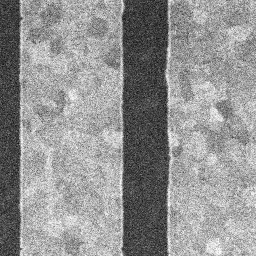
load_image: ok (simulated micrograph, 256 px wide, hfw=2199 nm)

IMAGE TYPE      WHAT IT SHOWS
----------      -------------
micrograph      one or a few lines or trenches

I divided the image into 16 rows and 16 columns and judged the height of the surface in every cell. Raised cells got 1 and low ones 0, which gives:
0111111100011111
0111111100011111
0111111100011111
0111111100011111
0111111100111111
0111111100011111
0111111100011111
0111111100011111
0111111100011111
0111111100011111
0111111100011111
0111111100011111
0111111100011111
0111111100011111
0111111100011111
0111111100011111